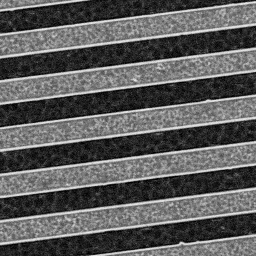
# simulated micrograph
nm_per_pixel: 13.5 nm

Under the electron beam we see parallel lines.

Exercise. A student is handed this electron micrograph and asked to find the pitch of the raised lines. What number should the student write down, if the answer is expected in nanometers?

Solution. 625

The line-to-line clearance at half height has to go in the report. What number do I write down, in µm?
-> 0.323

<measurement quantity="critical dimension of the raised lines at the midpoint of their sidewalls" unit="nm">298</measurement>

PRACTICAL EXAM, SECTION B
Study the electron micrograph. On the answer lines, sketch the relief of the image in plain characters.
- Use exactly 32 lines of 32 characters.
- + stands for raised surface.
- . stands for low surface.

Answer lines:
++++++........................++
......................++++++++++
..............++++++++++++++++++
.......+++++++++++++++++++++....
++++++++++++++++++++............
+++++++++++++...................
+++++........................+++
.....................+++++++++++
..............++++++++++++++++++
......++++++++++++++++++++......
+++++++++++++++++++.............
+++++++++++.....................
+++........................+++++
....................++++++++++++
............++++++++++++++++++++
....++++++++++++++++++++++......
++++++++++++++++++..............
++++++++++......................
++.........................+++++
...................+++++++++++++
...........+++++++++++++++++++++
...+++++++++++++++++++++........
++++++++++++++++................
++++++++........................
+........................+++++++
.................+++++++++++++++
.........++++++++++++++++++++++.
..+++++++++++++++++++++.........
+++++++++++++++.................
++++++++........................
.......................+++++++++
................++++++++++++++++